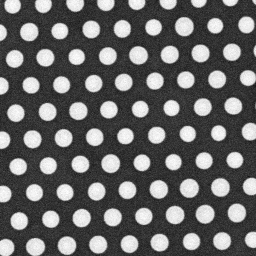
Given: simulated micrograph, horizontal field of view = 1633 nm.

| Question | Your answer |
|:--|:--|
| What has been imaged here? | an array of small figures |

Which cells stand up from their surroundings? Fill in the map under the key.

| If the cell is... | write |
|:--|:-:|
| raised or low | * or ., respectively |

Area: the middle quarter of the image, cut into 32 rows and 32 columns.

................................
................................
......................**.....***
......***....****....****...****
*....****....****....****...****
*....****....****....***.....***
*.....***.....**................
................................
................................
...........*......**......**....
..***....****....****....****...
.*****...****....****....****...
..****...****.....***.....**....
..***...........................
................................
................................
.......**.....***.....***....***
**....****...****....****....***
**....****....***....****....***
**....***.....***.....**........
*...............................
................................
................................
...**.....***.....***.....***...
..****....****....***....****...
..****....****....***.....***...
...***....***......*............
................................
................................
...............*......***.....**
*......***....****....****...***
**....****....****....****...***